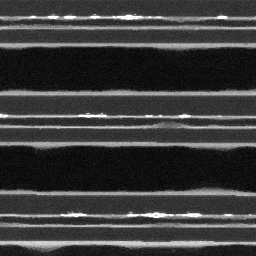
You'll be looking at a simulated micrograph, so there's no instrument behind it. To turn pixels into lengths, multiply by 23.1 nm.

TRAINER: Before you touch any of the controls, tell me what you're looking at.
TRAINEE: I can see lines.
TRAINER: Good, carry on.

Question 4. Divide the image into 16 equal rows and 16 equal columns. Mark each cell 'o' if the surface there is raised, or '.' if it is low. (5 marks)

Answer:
oooooooooooooooo
oooooooooooooooo
oooooooooooooooo
................
................
................
oooooooooooooooo
oooooooooooooooo
oooooooooooooooo
................
................
................
oooooooooooooooo
oooooooooooooooo
oooooooooooooooo
................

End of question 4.